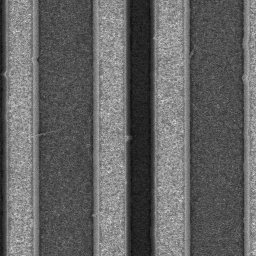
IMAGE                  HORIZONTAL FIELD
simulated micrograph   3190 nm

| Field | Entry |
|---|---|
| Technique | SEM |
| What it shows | one or a few lines or trenches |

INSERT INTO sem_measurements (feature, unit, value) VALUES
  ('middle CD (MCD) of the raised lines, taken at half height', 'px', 31.7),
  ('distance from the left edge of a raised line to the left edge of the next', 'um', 0.932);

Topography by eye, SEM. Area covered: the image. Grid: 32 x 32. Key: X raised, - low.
-XXX--------XXXX---XXXX--------X
-XXX--------XXXX---XXXX--------X
-XXX--------XXXX---XXXX--------X
-XXX--------XXXX---XXXX--------X
-XXX--------XXXX---XXXX--------X
-XXX--------XXXX---XXXX--------X
-XXX--------XXXX---XXXX--------X
-XXX--------XXXX---XXXX--------X
-XXX--------XXXX---XXXX--------X
XXXX--------XXXX---XXXX--------X
-XXX--------XXXX---XXXX--------X
-XXX--------XXXX---XXXX--------X
-XXX--------XXXX---XXXX--------X
-XXX--------XXXX---XXXX--------X
-XXX--------XXXX---XXXX--------X
-XXX--------XXXX---XXXX--------X
-XXXX-------XXXX---XXXX--------X
-XXX--------XXXX---XXXX--------X
-XXX--------XXXX---XXXX--------X
-XXX--------XXXX---XXXX--------X
-XXX--------XXXX---XXXX--------X
-XXX--------XXXX---XXXX--------X
-XXXX-------XXXX---XXXX--------X
-XXXX-------XXXX---XXXX--------X
-XXXX-------XXXX---XXXX--------X
-XXXX-------XXXX---XXXX--------X
-XXXX-------XXXX---XXXX--------X
-XXXX-------XXXX---XXXX--------X
-XXXX-------XXXX---XXXX--------X
-XXXX-------XXXX---XXXX--------X
-XXXX-------XXXX---XXXX--------X
-XXXX-------XXXX---XXXX--------X